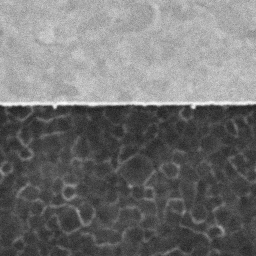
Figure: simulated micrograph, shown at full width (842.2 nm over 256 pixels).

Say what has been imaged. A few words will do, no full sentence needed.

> one or a few lines or trenches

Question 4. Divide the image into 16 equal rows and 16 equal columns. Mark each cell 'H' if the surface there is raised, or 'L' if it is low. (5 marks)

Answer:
HHHHHHHHHHHHHHHH
HHHHHHHHHHHHHHHH
HHHHHHHHHHHHHHHH
HHHHHHHHHHHHHHHH
HHHHHHHHHHHHHHHH
HHHHHHHHHHHHHHHH
HHHHLLLLLLLLLLLL
LLLLLLLLLLLLLLLL
LLLLLLLLLLLLLLLL
LLLLLLLLLLLLLLLL
LLLLLLLLHLLLLLLL
LLLLLLLLLLLLLLLL
LLLLLLLLLLLLLLLL
LLLLLLLLLLLLLLLL
LLLLLLLLLLLLLLLL
LLLLLLLLLLLLLLLL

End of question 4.